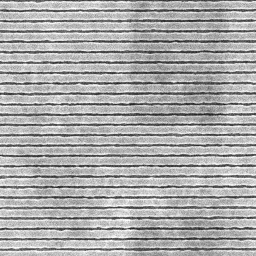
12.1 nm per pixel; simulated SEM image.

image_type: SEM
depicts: parallel lines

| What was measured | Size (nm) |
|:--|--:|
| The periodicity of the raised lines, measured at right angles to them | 125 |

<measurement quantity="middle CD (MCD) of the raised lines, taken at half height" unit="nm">94.9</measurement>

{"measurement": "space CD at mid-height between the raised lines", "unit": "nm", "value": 31.6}